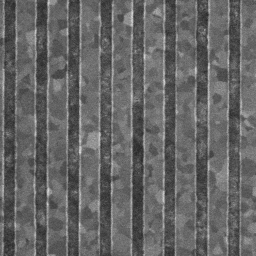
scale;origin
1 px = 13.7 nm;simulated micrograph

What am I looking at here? parallel lines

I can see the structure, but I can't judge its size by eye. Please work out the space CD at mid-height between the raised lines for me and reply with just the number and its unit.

176 nanometres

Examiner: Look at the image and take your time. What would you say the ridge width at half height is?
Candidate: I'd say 265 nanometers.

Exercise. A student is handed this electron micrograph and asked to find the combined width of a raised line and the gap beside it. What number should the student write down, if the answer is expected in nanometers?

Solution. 439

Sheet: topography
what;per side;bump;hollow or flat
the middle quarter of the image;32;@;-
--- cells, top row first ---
@---@@@@@---@@@@@---@@@@@---@@@@
@---@@@@@---@@@@@---@@@@@---@@@@
@---@@@@@---@@@@@---@@@@@---@@@@
@---@@@@@---@@@@@---@@@@@---@@@@
@---@@@@@---@@@@@---@@@@@---@@@@
@---@@@@@---@@@@@---@@@@@---@@@@
@---@@@@@---@@@@@---@@@@@---@@@@
@---@@@@@---@@@@@---@@@@@---@@@@
@---@@@@@---@@@@@---@@@@@---@@@@
@---@@@@@---@@@@@---@@@@@---@@@@
@---@@@@@---@@@@@---@@@@@---@@@@
@---@@@@@---@@@@@---@@@@@---@@@@
@---@@@@@---@@@@@---@@@@@---@@@@
@---@@@@@---@@@@@---@@@@@---@@@@
@---@@@@@---@@@@@---@@@@@---@@@@
@---@@@@@---@@@@@---@@@@@---@@@@
@---@@@@@---@@@@@---@@@@@---@@@@
@---@@@@@---@@@@@---@@@@@---@@@@
@---@@@@@---@@@@@---@@@@@---@@@@
@---@@@@@---@@@@@---@@@@@---@@@@
@---@@@@@---@@@@@---@@@@@---@@@@
@---@@@@@---@@@@@---@@@@@---@@@@
@---@@@@@---@@@@@---@@@@@---@@@@
@---@@@@@---@@@@@---@@@@@---@@@@
@---@@@@@---@@@@@---@@@@@---@@@@
@---@@@@@---@@@@@---@@@@@---@@@@
@---@@@@@---@@@@@---@@@@@---@@@@
@---@@@@@---@@@@@---@@@@@---@@@@
@---@@@@@---@@@@@---@@@@@---@@@@
@---@@@@@---@@@@@---@@@@@---@@@@
@---@@@@@---@@@@@---@@@@@---@@@@
@---@@@@@---@@@@@---@@@@@---@@@@